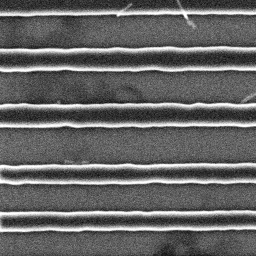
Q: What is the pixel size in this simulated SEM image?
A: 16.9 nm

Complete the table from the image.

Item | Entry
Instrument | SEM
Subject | groups of lines, slits or small figures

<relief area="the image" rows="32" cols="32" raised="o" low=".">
oooooooooooooooooooooooooooooooo
oooooooooooooooooooooooooooooooo
................................
................................
................................
................................
oooooooooooooooooooooooooooooooo
oooooooooooooooooooooooooooooooo
oooooooooooooooooooooooooooooooo
................................
................................
................................
................................
oooooooooooooooooooooooooooooooo
oooooooooooooooooooooooooooooooo
oooooooooooooooooooooooooooooooo
................................
................................
................................
................................
.........................o....oo
oooooooooooooooooooooooooooooooo
oooooooooooooooooooooooooooooooo
................................
................................
................................
..........................oooooo
oooooooooooooooooooooooooooooooo
oooooooooooooooooooooooooooooooo
................................
................................
................................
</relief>